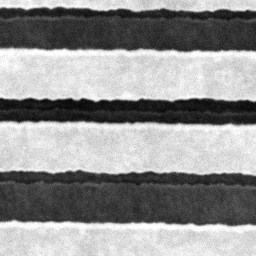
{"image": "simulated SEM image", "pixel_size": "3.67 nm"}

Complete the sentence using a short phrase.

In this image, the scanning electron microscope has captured lines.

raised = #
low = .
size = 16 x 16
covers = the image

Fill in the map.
.#...###########
................
................
################
################
################
................
................
################
################
################
................
................
................
################
################